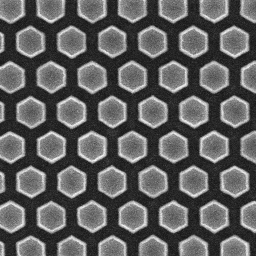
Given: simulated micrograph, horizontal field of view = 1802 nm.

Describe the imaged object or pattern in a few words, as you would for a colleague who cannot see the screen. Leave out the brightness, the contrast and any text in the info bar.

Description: a regular array of raised bodies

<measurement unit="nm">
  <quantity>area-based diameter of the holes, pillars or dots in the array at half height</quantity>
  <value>200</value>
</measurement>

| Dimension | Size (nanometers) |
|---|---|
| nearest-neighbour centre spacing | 283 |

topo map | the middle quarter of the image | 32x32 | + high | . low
.....++++......++++......++++...
....++++++....++++++....+++++++.
....++++++....++++++....+++++++.
....++++++....++++++....+++++++.
....++++++....++++++....+++++++.
....++++++....++++++.....+++++..
......++........++........++....
................................
.+.........++.........+.........
++++......++++......++++......++
+++++....++++++....+++++++...+++
+++++....++++++....+++++++...+++
+++++....++++++....+++++++...+++
+++++....++++++....+++++++...+++
++++......++++......+++++.....++
.++.........+.........+.........
................................
......++........++........++....
....++++++....++++++.....+++++..
....++++++....++++++....+++++++.
....++++++....++++++....+++++++.
....++++++....++++++....+++++++.
....++++++....++++++....+++++++.
.....++++.......+++.......+++...
.......+........................
................................
++++......+++........+++.......+
+++++....++++++....++++++....+++
+++++....++++++....+++++++...+++
+++++....++++++....+++++++...+++
+++++....++++++....+++++++...+++
+++++....++++++.....+++++.....++